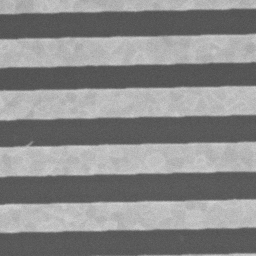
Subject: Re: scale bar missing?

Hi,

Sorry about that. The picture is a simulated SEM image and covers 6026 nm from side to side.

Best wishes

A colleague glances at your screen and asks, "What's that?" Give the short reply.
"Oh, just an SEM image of lines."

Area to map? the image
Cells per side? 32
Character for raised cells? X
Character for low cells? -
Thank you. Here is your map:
XXXXXXXXXXXXXXXXXXXXXXXXXXXXXXXX
XXXXXXXX------------------------
--------------------------------
--------------------------------
-------------------------XXXXXXX
XXXXXXXXXXXXXXXXXXXXXXXXXXXXXXXX
XXXXXXXXXXXXXXXXXXXXXXXXXXXXXXXX
XXXXXXXXXXXXXXXXXXXXXXXXXXXXXXXX
--------------------------------
--------------------------------
--------------------------------
XXXXXXXXXXXXXXXXXXXXXXXXXXXXXXXX
XXXXXXXXXXXXXXXXXXXXXXXXXXXXXXXX
XXXXXXXXXXXXXXXXXXXXXXXXXXXXXXXX
XXXXXXXXXXXXXXXXXXXXXXX---------
--------------------------------
--------------------------------
--------------------------------
---XXXXXXXXXXXXXXXXXXXXXXXXXXXXX
XXXXXXXXXXXXXXXXXXXXXXXXXXXXXXXX
XXXXXXXXXXXXXXXXXXXXXXXXXXXXXXXX
XXXXXXXXXXXXXXXXXXXXXX----------
--------------------------------
--------------------------------
--------------------------------
-------XXXXXXXXXXXXXXXXXXXXXXXXX
XXXXXXXXXXXXXXXXXXXXXXXXXXXXXXXX
XXXXXXXXXXXXXXXXXXXXXXXXXXXXXXXX
XXXXXXXXXXXXXXXXXXXXXXXXXX------
--------------------------------
--------------------------------
--------------------------------